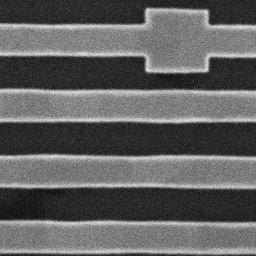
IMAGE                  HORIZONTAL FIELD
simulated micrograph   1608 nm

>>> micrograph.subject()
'wiring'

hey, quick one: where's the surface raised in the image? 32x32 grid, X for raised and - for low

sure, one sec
--------------------------------
------------------XXXXXXXX------
------------------XXXXXXXX------
XXXXXXXXXXXXXXXXXXXXXXXXXXXXXXXX
XXXXXXXXXXXXXXXXXXXXXXXXXXXXXXXX
XXXXXXXXXXXXXXXXXXXXXXXXXXXXXXXX
XXXXXXXXXXXXXXXXXXXXXXXXXXXXXXXX
------------------XXXXXXXX------
------------------XXXXXXXX------
--------------------------------
--------------------------------
XXXXXXXXXXXXXXXXXXXXXXXXXXXXXXXX
XXXXXXXXXXXXXXXXXXXXXXXXXXXXXXXX
XXXXXXXXXXXXXXXXXXXXXXXXXXXXXXXX
XXXXXXXXXXXXXXXXXXXXXXXXXXXXXXXX
--------------------------------
--------------------------------
--------------------------------
--------------------------------
XXXXXXXXXXX---------XXXX--------
XXXXXXXXXXXXXXXXXXXXXXXXXXXXXXXX
XXXXXXXXXXXXXXXXXXXXXXXXXXXXXXXX
XXXXXXXXXXXXXXXXXXXXXXXXXXXXXXXX
--------------------------------
--------------------------------
--------------------------------
--------------------------------
--------------------------------
XXXXXXXXXXXXXXXXXXXXXXXXXXXXXXXX
XXXXXXXXXXXXXXXXXXXXXXXXXXXXXXXX
XXXXXXXXXXXXXXXXXXXXXXXXXXXXXXXX
XXXXXXXXXXXXXXXXXXXXXXXXXXXXXXXX